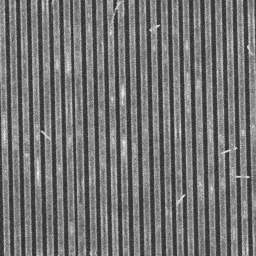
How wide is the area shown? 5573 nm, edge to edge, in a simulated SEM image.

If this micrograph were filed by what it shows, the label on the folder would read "parallel lines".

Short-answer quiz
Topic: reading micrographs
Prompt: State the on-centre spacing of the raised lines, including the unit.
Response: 236 nm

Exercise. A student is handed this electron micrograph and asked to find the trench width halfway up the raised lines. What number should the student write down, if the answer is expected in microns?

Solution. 0.103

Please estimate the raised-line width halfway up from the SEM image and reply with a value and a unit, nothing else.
139 nm